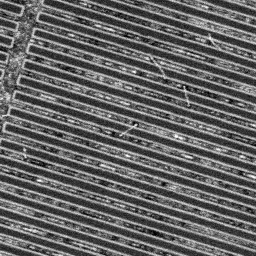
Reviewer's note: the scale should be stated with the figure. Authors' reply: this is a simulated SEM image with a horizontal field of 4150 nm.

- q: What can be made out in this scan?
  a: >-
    parallel lines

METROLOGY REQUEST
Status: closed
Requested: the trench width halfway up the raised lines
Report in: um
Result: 0.128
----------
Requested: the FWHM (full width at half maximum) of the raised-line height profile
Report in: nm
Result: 143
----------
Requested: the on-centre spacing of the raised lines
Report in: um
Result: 0.268